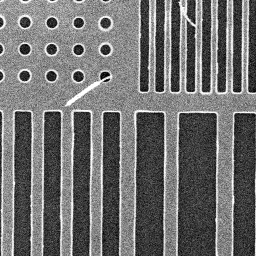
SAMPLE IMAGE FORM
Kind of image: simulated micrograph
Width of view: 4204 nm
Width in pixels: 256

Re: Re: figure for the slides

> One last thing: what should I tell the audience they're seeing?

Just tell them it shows groups of lines, slits or small figures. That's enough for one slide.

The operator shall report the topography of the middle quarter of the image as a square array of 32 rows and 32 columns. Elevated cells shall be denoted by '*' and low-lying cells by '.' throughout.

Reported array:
*******************..**..*...*..
*******************..**..*...*..
**...****..********..**..*...*..
**...****..********..**..*...*..
***.******.********..**..*...*..
*******************..**..*...*..
*******************..**..*...*..
********************************
********************************
********************************
********************************
********************************
**.....***....****.......****...
**.....***....****.......****...
**.....**.....****.......****...
**.....**.....****.......****...
**.....**.....****.......****...
**.....**.....****.......****...
**.....**.....****.......****...
**.....**.....****.......***....
**.....**.....****.......***....
**.....**.....****.......***....
**.....**.....****.......***....
**.....**.....****.......***....
**.....**.....****.......***....
**.....**.....****.......***....
**.....**.....****.......***....
**.....**.....****.......***....
**.....**.....****.......***....
**.....**.....****.......***....
**.....**.....****.......***....
**.....**.....****.......***....